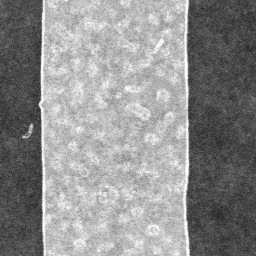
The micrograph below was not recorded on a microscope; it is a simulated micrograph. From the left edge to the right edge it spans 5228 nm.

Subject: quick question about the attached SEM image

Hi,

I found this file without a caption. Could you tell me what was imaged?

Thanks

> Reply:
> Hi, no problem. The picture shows one or a few lines or trenches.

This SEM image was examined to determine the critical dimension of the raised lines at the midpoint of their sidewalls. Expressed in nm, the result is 2920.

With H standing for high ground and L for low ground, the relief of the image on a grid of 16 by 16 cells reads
LLLHHHHHHHHHLLLL
LLLHHHHHHHHHLLLL
LLLHHHHHHHHHLLLL
LLLHHHHHHHHHLLLL
LLLHHHHHHHHHLLLL
LLLHHHHHHHHHLLLL
LLLHHHHHHHHHLLLL
LLLHHHHHHHHHLLLL
LLLHHHHHHHHHLLLL
LLLHHHHHHHHHLLLL
LLLHHHHHHHHHLLLL
LLLHHHHHHHHHLLLL
LLLHHHHHHHHHLLLL
LLLHHHHHHHHHLLLL
LLLHHHHHHHHHLLLL
LLLHHHHHHHHHLLLL